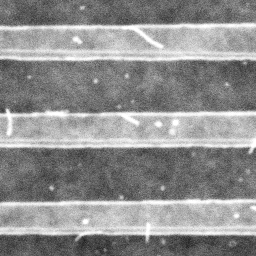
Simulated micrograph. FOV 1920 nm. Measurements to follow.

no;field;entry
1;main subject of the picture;lines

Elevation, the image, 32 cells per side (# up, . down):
................................
................................
................................
..##############################
################################
################################
################################
................................
................................
................................
................................
................................
................................
................................
################################
################################
################################
################################
................................
................................
................................
................................
................................
................................
................................
.......#########################
################################
################################
################################
................................
................................
................................